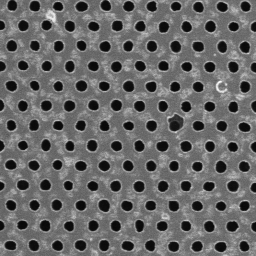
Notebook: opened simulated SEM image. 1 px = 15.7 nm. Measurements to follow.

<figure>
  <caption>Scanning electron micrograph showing a regular array of holes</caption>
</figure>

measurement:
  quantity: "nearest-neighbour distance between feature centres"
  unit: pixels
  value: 22.6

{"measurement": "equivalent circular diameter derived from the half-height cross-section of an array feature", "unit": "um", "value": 0.169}